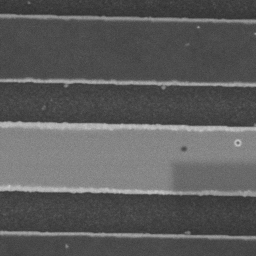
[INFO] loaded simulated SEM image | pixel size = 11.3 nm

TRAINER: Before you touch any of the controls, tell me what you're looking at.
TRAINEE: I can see lines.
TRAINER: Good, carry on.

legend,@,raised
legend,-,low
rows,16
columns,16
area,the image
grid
----------------
@@@@@@@@@@@@@@@@
@@@@@@@@@@@@@@@@
@@@@@@@@@@@@@@@@
@@@@@@@@@@@@@@@@
----------------
----------------
----------------
@@@@@@@@@@@@@@@@
@@@@@@@@@@@@@@@@
@@@@@@@@@@@@@@@@
@@@@@@@@@@@@@@@@
----------------
----------------
----------------
@@@@@@@@@@@@@@@@